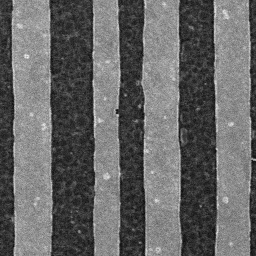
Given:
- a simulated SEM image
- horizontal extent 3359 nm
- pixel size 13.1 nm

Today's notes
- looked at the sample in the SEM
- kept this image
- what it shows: one or a few lines or trenches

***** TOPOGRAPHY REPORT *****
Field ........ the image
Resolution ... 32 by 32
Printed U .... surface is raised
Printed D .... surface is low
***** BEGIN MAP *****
DDUUUUDDDDDDUUUDDDUUUUDDDDDUUUUD
DDUUUUDDDDDDUUUDDDUUUUDDDDDUUUUD
DDUUUUDDDDDDUUUDDDUUUUDDDDDUUUUD
DDUUUUDDDDDDUUUDDDUUUUDDDDDUUUUD
DDUUUUDDDDDDUUUDDDUUUUDDDDDUUUUD
DDUUUUDDDDDDUUUDDDUUUUDDDDDUUUUD
DDUUUUDDDDDDUUUDDDUUUUDDDDDUUUUD
DDUUUUDDDDDDUUUDDDUUUUDDDDDUUUUD
DDUUUUDDDDDDUUUDDDUUUUDDDDDUUUUD
DDUUUUDDDDDDUUUDDDUUUUDDDDDUUUUD
DDUUUUDDDDDDUUUDDDUUUUDDDDDUUUUD
DDUUUUDDDDDDUUUDDDUUUUDDDDDUUUUD
DDUUUUDDDDDDUUUDDDUUUUDDDDDUUUUD
DDUUUUDDDDDDUUUDDDUUUUDDDDDUUUUD
DDUUUUDDDDDDUUUDDDUUUUDDDDDUUUUD
DDUUUUDDDDDDUUUDDDUUUUDDDDDUUUUD
DDUUUUDDDDDDUUUDDDUUUUDDDDDUUUUD
DDUUUUDDDDDDUUUDDDUUUUUDDDDUUUUD
DDUUUUDDDDDDUUUDDDUUUUDDDDDUUUUD
DDUUUUDDDDDDUUUDDDUUUUDDDDDUUUUD
DDUUUUDDDDDDUUUDDDUUUUDDDDDUUUUD
DDUUUUDDDDDDUUUDDDUUUUDDDDDUUUUD
DDUUUUDDDDDDUUUDDDUUUUDDDDDUUUUD
DDUUUUDDDDDDUUUDDDUUUUUDDDDUUUUD
DDUUUUDDDDDDUUUDDDUUUUUDDDDUUUUD
DDUUUUUDDDDDUUUDDDUUUUDDDDDUUUUD
DDUUUUDDDDDDUUUDDDUUUUDDDDDUUUUD
DDUUUUDDDDDDUUUDDDUUUUDDDDDUUUUD
DDUUUUDDDDDDUUUDDDUUUUUDDDDUUUUD
DDUUUUDDDDDDUUUDDDUUUUUDDDDUUUUD
DDUUUUDDDDDDUUUDDDUUUUUDDDDUUUUD
DDUUUUDDDDDDUUUDDDUUUUUDDDDUUUUD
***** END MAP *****